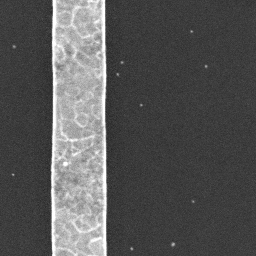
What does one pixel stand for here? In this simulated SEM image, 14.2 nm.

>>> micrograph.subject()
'wiring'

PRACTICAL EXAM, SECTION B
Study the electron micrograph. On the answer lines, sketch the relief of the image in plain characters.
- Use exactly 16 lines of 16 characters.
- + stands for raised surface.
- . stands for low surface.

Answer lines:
...+++..........
...+++..........
...++++.........
...++++.........
...++++.........
...++++.........
...++++.........
...++++.........
...++++.........
...++++.........
...++++.........
...++++.........
...++++.........
...++++.........
...++++.........
...++++.........